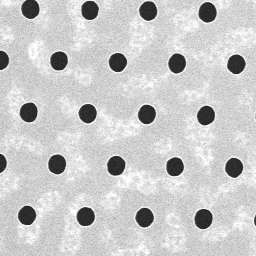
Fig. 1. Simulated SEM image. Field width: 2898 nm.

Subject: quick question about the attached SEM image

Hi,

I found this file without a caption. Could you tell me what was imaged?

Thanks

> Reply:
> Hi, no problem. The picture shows a regular array of holes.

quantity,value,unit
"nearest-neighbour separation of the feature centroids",58.9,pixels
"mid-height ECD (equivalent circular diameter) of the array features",0.214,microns